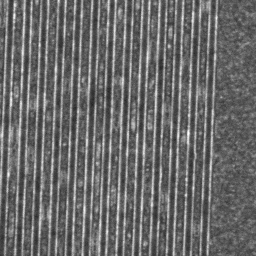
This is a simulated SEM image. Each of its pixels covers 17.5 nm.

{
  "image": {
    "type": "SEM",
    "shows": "parallel lines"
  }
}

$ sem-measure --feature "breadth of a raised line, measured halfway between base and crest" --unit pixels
8.24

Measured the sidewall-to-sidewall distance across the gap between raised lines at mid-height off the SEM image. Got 144 nanometres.